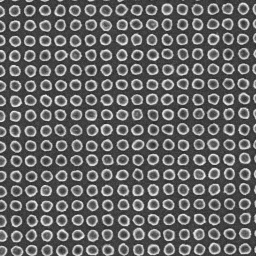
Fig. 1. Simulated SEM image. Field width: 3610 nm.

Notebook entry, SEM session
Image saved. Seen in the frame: a regular array of raised bodies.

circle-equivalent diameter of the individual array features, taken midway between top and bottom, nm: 156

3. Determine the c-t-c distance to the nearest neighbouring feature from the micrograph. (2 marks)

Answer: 204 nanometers